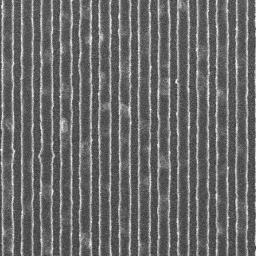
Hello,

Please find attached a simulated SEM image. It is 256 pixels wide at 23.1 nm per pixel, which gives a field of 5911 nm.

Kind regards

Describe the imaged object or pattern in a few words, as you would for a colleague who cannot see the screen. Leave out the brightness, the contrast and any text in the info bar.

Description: parallel lines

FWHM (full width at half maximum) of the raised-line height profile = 271 nm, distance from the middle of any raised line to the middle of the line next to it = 450 nm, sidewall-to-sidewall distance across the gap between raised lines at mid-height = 176 nm